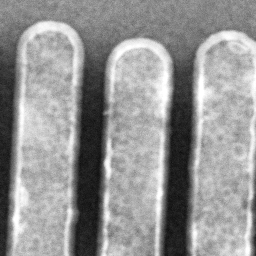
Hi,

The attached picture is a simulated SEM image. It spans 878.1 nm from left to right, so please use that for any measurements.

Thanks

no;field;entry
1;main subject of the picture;one or a few lines or trenches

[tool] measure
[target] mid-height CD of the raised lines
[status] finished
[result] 60.6 pixels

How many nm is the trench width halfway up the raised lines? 99.4